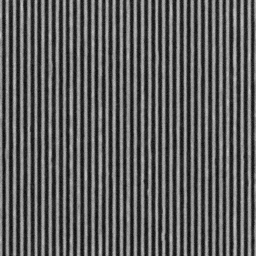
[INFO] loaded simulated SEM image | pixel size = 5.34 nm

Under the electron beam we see parallel lines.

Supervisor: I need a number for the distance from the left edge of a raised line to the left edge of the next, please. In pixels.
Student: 7.12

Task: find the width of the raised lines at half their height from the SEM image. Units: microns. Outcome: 0.016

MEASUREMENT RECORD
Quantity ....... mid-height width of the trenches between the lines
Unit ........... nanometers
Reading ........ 22.7